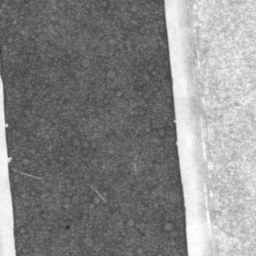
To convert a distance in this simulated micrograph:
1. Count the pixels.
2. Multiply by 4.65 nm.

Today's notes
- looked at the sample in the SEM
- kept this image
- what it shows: one or a few lines or trenches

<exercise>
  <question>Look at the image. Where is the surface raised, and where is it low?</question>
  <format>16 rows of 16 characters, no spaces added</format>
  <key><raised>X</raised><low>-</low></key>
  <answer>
-----------XXXXX
-----------XXXXX
-----------XXXXX
-----------XXXXX
-----------XXXXX
-----------XXXXX
-----------XXXXX
-----------XXXXX
------------XXXX
------------XXXX
------------XXXX
------------XXXX
------------XXXX
------------XXXX
------------XXXX
------------XXXX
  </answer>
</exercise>